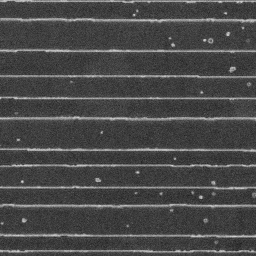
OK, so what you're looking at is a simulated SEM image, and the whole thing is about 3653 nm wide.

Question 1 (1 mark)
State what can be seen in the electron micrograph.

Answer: lines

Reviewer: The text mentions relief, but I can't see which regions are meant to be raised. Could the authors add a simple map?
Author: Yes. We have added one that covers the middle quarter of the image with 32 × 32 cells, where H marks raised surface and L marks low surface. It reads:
LLLLLLLLLLLLLLLLLLLLLLLLLLLLLLLL
LLLLLLLLLLLLLLLLLLLLLLLLLLLLLLLL
LLLLLLLLLLLLLLLLLLLLLLLLLLLLLLLL
HHHHHHHHHHHHHHHHHHHHHHHHHHHHHHHH
HHHHHHHHHHHHHHHHHHHHHHHHHHHHHHHH
HHHHHHHHHHHHHHHHHHHHHHHHHHHHHHHH
HHHHHHHHHHHHHHHHHHHHHHHHHHHHHHHH
HHHHHHHHHHHHHHHHHHHHHHHHHHHHHHHH
HHHHHHHHHHHHHHHHHHHHHHHHHHHHHHHH
LLLLLLLLLLLLLLLLLLLLLLLLLLLLLLLL
LLLLLLLLLLLLLLLLLLLLLLLLLLLLLLLL
LLLLLLLLLLLLLLLLLLLLLLLLLLLLLLLL
LLLLLLLLLLLLLLLLLLLLLLLLLLLLLLLL
LLLLLLLLLLLLLLLLLLLLLLLLLLLLLLLL
HHHHHHHHHHHHHHHHHHHHHHHHHHHHHHHH
HHHHHHHHHHHHHHHHHHHHHHHHHHHHHHHH
HHHHHHHHHHHHHHHHHHHHHHHHHHHHHHHH
HHHHHHHHHHHHHHHHHHHHHHHHHHHHHHHH
HHHHHHHHHHHHHHHHHHHHHHHHHHHHHHHH
HHHHHHHHHHHHHHHHHHHHHHHHHHHHHHHH
HHHHHHHHHHHHHHHHHHHHHHHHHHHHHHHH
HHHHHHHHHHHHHHHHHHHHHHHHHHHHHHHH
LLLLLLLLLLLLLLLLLLLLLLLLLLLLLLLL
LLLLLLLLLLLLLLLLLLLLLLLLLLLLLLLL
LLLLLLLLLLLLLLLLLLLLLLLLLLLLLLLL
HLLHHHHHHHHHHHHHHHHHHHHHHHHHLLLL
HHHHHHHHHHHHHHHHHHHHHHHHHHHHHHHH
HHHHHHHHHHHHHHHHHHHHHHHHHHHHHHHH
HHHHHHHHHHHHHHHHHHHHHHHHHHHHHHHH
HHHHHHHHHHHHHHHHHHHHHHHHHHHHHHHH
HHHHHHHHHHHHHHHHHHHHHHHHHHHHHHHH
LLLLLLLLLLLLLLLLLLLLLLLLLLLLLLLL